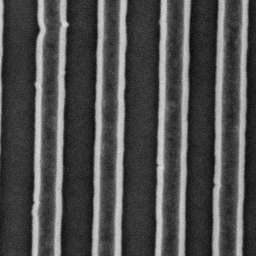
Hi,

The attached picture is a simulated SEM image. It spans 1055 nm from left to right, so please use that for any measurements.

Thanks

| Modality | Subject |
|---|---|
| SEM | parallel lines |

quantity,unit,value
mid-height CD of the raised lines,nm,102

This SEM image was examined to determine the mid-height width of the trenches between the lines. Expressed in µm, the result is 0.151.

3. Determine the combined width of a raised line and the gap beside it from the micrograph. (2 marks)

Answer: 249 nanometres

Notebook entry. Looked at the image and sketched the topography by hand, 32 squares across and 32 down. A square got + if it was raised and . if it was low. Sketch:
.....+++.....++.....+++.....+++.
.....+++.....++.....+++.....+++.
.....+++.....++.....+++.....+++.
.....+++.....++.....+++.....+++.
.....+++.....++.....+++.....+++.
.....+++....+++.....+++....++++.
.....+++....+++.....+++....++++.
.....+++....+++.....+++....+++..
.....+++....+++.....+++....+++..
.....+++....+++.....+++....++++.
.....+++....+++.....+++....+++..
.....+++....+++.....+++....+++..
.....+++....+++.....+++....+++..
.....+++....+++.....+++....+++..
.....+++....+++.....+++....+++..
.....+++....+++.....+++....+++..
.....+++....+++.....+++....+++..
.....+++....+++.....+++....+++..
.....++.....+++.....+++....+++..
.....+++....+++.....+++....+++..
.....+++....+++.....+++....+++..
.....+++....+++.....+++....+++..
.....+++....+++.....+++....+++..
.....++.....+++.....+++....+++..
....+++.....+++.....+++....+++..
....+++.....+++.....+++....+++..
....+++.....+++.....+++....+++..
....+++.....+++.....+++....+++..
....+++.....+++.....+++....+++..
....+++.....+++.....+++....+++..
....+++.....+++.....+++....+++..
....+++.....+++.....+++....+++..